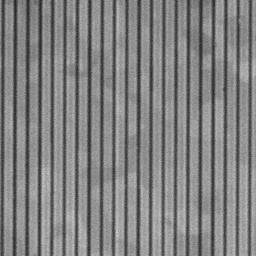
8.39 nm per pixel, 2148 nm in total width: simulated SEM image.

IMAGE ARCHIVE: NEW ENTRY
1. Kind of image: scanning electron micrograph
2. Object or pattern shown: parallel lines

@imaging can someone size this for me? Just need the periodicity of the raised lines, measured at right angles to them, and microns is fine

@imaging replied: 0.104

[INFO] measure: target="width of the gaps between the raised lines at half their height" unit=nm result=38.8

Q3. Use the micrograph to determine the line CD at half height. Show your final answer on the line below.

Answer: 70.3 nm